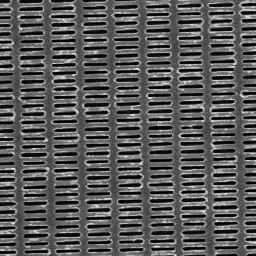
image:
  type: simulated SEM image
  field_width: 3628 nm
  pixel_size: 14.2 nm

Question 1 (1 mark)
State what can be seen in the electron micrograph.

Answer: a regular array of holes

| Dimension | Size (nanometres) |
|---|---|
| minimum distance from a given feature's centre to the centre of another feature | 113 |